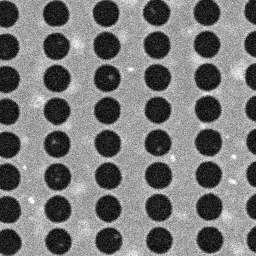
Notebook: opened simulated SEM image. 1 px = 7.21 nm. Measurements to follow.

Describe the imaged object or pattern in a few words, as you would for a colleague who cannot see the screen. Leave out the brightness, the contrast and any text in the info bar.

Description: a regular array of holes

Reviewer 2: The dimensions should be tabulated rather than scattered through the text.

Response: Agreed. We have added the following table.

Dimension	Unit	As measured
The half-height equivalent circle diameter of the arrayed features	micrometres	0.199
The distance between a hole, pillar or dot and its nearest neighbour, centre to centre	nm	233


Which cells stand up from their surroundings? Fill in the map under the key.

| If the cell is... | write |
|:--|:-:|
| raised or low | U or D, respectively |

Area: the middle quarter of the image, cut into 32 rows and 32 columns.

UUUUUUUUUDDDUUUUUUUUUDDDDUUUUUUU
DUUUUUUUDDDDDUUUUUUUDDDDDDUUUUUU
DUUUUUUUDDDDDDUUUUUUDDDDDDDUUUUU
DDUUUUUDDDDDDDUUUUUUDDDDDDDUUUUU
DDUUUUUDDDDDDDUUUUUUDDDDDDDUUUUU
DUUUUUUUDDDDDDUUUUUUUDDDDDUUUUUU
UUUUUUUUUDDDDUUUUUUUUUDDDUUUUUUU
UUUUUUUUUUUUUUUUUUUUUUUUUUUUUUUU
UUUUUUUUUUDDUUUUUUUUUUDDDUUUUUUU
DUUUUUUUDDDDDDUUUUUUUDDDDDUUUUUU
DDUUUUUUDDDDDDUUUUUUDDDDDDDUUUUU
DDUUUUUDDDDDDDUUUUUUDDDDDDDUUUUU
DDUUUUUDDDDDDDUUUUUUDDDDDDDUUUUU
DUUUUUUUDDDDDDUUUUUUUDDDDDUUUUUU
UUUUUUUUUDDDDUUUUUUUUUDDDUUUUUUU
UUUUUUUUUUUUUUUUUUUUUUUUUUUUUUUU
UUUUUUUUUUDUUUUUUUUUUUDDDUUUUUUU
DUUUUUUUUDDDDDUUUUUUUDDDDDUUUUUU
DUUUUUUUDDDDDDUUUUUUDDDDDDDUUUUU
DDUUUUUDDDDDDDUUUUUUDDDDDDDUUUUU
DDUUUUUUDDDDDDUUUUUUDDDDDDDUUUUU
DUUUUUUUDDDDDDUUUUUUDDDDDDDUUUUU
DUUUUUUUUDDDDUUUUUUUUDDDDDUUUUUU
UUUUUUUUUUUUUUUUUUUUUUUUUUUUUUUU
UUUUUUUUUUUUUUUUUUUUUUUDUUUUUUUU
DUUUUUUUUDDDDUUUUUUUUDDDDDUUUUUU
DUUUUUUUDDDDDDUUUUUUDDDDDDDUUUUU
DDUUUUUUDDDDDDUUUUUUDDDDDDDUUUUU
DDUUUUUUDDDDDDDUUUUUDDDDDDDUUUUU
DDUUUUUUDDDDDDUUUUUUUDDDDDDUUUUU
DUUUUUUUUDDDDDUUUUUUUDDDDDUUUUUU
UUUUUUUUUUUDUUUUUUUUUUUUUUUUUUUU